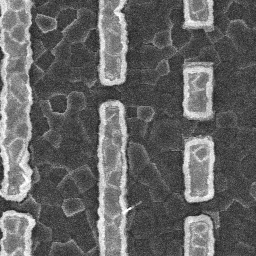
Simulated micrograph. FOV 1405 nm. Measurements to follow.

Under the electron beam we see one or a few lines or trenches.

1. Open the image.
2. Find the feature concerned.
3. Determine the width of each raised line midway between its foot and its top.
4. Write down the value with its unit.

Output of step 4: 137 nm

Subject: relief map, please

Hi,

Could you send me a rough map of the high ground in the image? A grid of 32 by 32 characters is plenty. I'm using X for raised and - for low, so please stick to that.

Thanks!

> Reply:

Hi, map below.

XXXX---------XX--------XXX------
XXXX---------XX--------XXX------
XXXX---------XX--------XXX------
XXXX--------XXXX----------------
XXX----------XXX----------------
XXXX---------XXX----------------
-XXX---------XXX----------------
-XXX---------XXX----------------
XXX----------XXX----------------
XXXX---------XX--------XXX------
-XXX-------------------XXX------
XXXX-------------------XXX------
XXXX-------------------XXX------
XXXX---------XX--------XXX------
XXX----------XX-----------------
XXXX---------XX-----------------
XXXX---------XXX----------------
XXX----------XXX----------------
XXX---------XXXX-------XXX------
XXX---------XXXX-------XXX------
-XX---------XXXX-------XXX------
-XXX---------XXX-------XXX------
-XXX---------XX--------XXX------
XXX----------XX--------XXX------
-XX---------XXX--------XXX------
-------------XX-----------------
-X-----------XXX----------------
XXXX---------XXX--------XX------
XXXX---------XX--------XXX------
XXXX---------XXX-------XXX------
XXXX---------XXX-------XXXX-----
XXXX---------XXX-------XXXX-----